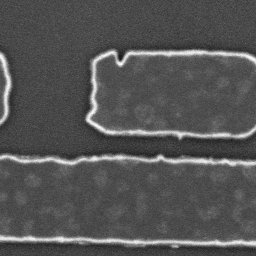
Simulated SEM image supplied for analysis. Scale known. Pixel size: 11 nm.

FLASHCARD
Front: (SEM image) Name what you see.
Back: one or a few lines or trenches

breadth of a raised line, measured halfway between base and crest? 892 nanometres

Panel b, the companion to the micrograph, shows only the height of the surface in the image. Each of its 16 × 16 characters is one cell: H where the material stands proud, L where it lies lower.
LLLLLLLLLLLLLLLL
LLLLLLLLLLLLLLLL
LLLLLLLLLLLLLLLL
LLLLLLHLHHHHHHHL
LLLLLLHHHHHHHHHH
HLLLLLHHHHHHHHHH
LLLLLLHHHHHHHHHH
LLLLLLHHHHHHHHHH
LLLLLLLLLLLLLLLL
LLLLLLLLLLLLLLLL
HHHHHHHHHHHHHHHH
HHHHHHHHHHHHHHHH
HHHHHHHHHHHHHHHH
HHHHHHHHHHHHHHHH
HHHHHHHHHHHHHHHH
LLLLLLLLLLLLLLLL